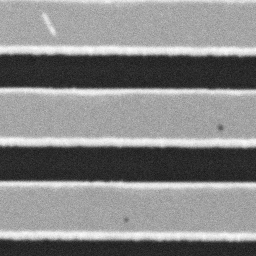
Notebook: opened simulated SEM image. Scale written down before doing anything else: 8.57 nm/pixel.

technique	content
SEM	lines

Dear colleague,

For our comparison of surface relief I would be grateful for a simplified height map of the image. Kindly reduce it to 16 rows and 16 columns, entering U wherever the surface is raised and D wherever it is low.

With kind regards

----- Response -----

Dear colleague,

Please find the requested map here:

UUUUUUUUUUUUUUUU
UUUUUUUUUUUUUUUU
UUUUUUUUUUUUUUUU
DDDDDDDDDDDDDDDD
DDDDDDDDDDDDDDDD
DDDDDDDDDDDDDDDD
UUUUUUUUUUUUUUUU
UUUUUUUUUUUUUUUU
UUUUUUUUUUUUUUUU
DDDDDDDDDDDDDDDD
DDDDDDDDDDDDDDDD
UUUUUUUUUUUUUUUU
UUUUUUUUUUUUUUUU
UUUUUUUUUUUUUUUU
UUUUUUUUUUUUUUUU
DDDDDDDDDDDDDDDD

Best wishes